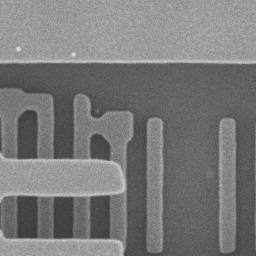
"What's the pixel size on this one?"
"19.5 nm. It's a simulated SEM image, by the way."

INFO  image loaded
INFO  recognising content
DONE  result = wiring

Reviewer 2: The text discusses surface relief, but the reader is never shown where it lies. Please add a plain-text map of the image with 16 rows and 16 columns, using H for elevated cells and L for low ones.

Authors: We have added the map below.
HHHHHHHHHHHHHHHH
HHHHHHHHHHHHHHHH
HHHHHHHHHHHHHHHH
HHHHHHHHHHHHHHHH
LLLLLLLLLLLLLLLL
LLLLLLLLLLLLLLLL
LLLLLLLLLLLLLLLL
LLLLLLLLLLLLLLLL
LLLLLLLLLLLLLLLL
LLLLLLLLLLLLLLLL
HHHHHHHLLLLLLLLL
HHHHHHHHLLLLLLLL
LLLLLLLLLLLLLLLL
LLLLLLLLLLLLLLLL
LLLLLLLLLLLLLLLL
HHHHHHHHLLLLLLLL